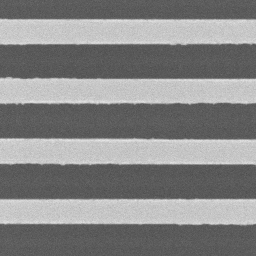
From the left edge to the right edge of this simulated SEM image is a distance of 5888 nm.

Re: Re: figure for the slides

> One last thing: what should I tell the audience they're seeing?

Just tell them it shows lines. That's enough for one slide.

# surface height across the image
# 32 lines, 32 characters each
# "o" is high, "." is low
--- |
................................
................................
o...............................
oooooooooooooooooooooooooooooooo
oooooooooooooooooooooooooooooooo
oooo............................
................................
................................
................................
................................
oooooooooooooooooooooooooooooooo
oooooooooooooooooooooooooooooooo
oooooooooooooooooooooooooooooooo
................................
................................
................................
................................
oooooooooooooooooooo............
oooooooooooooooooooooooooooooooo
oooooooooooooooooooooooooooooooo
...............................o
................................
................................
................................
................................
oooooooooooooooooooooooooooooooo
oooooooooooooooooooooooooooooooo
oooooooooooooooooooooooooooooooo
................................
................................
................................
................................